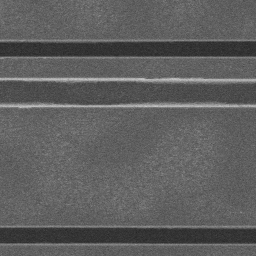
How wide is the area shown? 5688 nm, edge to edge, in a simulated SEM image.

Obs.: lines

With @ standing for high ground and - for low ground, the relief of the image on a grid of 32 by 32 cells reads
@@@@@@@@@@@@@@@@@@@@@@@@@@@@@@@@
@@@@@@@@@@@@@@@@@@@@@@@@@@@@@@@@
@@@@@@@@@@@@@@@@@@@@@@@@@@@@@@@@
@@@@@@@@@@@@@@@@@@@@@@@@@@@@@@@@
@@@@@@@@@@@@@@@@@@@@@@@@@@@@@@@@
--------------------------------
--------------------------------
@@@@@@@@@@@@@@@@@@@@@@@@@@@@@@@@
@@@@@@@@@@@@@@@@@@@@@@@@@@@@@@@@
@@@@@@@@@@@@@@@@@@@@@@@@@@@@@@@@
--------------------------------
--------------------------------
--------------------------------
@@@@@@@@@@@@@@@@@@@@@@@@@@@@@@@@
@@@@@@@@@@@@@@@@@@@@@@@@@@@@@@@@
@@@@@@@@@@@@@@@@@@@@@@@@@@@@@@@@
@@@@@@@@@@@@@@@@@@@@@@@@@@@@@@@@
@@@@@@@@@@@@@@@@@@@@@@@@@@@@@@@@
@@@@@@@@@@@@@@@@@@@@@@@@@@@@@@@@
@@@@@@@@@@@@@@@@@@@@@@@@@@@@@@@@
@@@@@@@@@@@@@@@@@@@@@@@@@@@@@@@@
@@@@@@@@@@@@@@@@@@@@@@@@@@@@@@@@
@@@@@@@@@@@@@@@@@@@@@@@@@@@@@@@@
@@@@@@@@@@@@@@@@@@@@@@@@@@@@@@@@
@@@@@@@@@@@@@@@@@@@@@@@@@@@@@@@@
@@@@@@@@@@@@@@@@@@@@@@@@@@@@@@@@
@@@@@@@@@@@@@@@@@@@@@@@@@@@@@@@@
@@@@@@@@@@@@@@@@@@@@@@@@@@@@@@@@
--------------------------------
--------------------------------
--------------------------------
@@@@@@@@@@@@@@@@@@@@@@@@@@@@@@@@